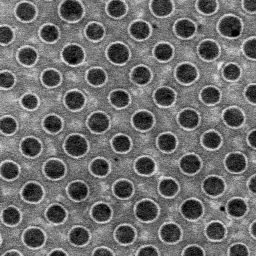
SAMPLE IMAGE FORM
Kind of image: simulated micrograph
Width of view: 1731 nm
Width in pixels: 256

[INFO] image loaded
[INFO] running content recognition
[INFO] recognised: a regular array of raised bodies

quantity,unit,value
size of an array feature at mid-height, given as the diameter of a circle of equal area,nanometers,144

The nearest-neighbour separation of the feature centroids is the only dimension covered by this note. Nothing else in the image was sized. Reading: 214 nm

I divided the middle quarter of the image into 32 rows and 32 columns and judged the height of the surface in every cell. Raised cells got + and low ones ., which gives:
..................++........++++
......++++.......++++.......++++
......++++.......+++++......++++
......+++++......+++++......++++
......++++.......++++........+++
.......++.......................
.............++........++++.....
+++++......+++++......++++++....
+++++......+++++......++++++....
+++++......+++++.......+++++....
+++++.......++++........+++.....
.+++..........................++
.......+++........++++......++++
......+++++......+++++......++++
......+++++......++++++......+++
......+++++......+++++.......+++
.......++++........++...........
..+.....................+++.....
.++++.......++++.......+++++....
++++++......+++++......+++++....
++++++......+++++......+++++....
++++++.......+++........++++....
.++++..........................+
........+..........+++.......+++
.......++++.......+++++......+++
......+++++......++++++......+++
......+++++.......+++++......+++
.......++++........+++........++
..........................+.....
..+++........++++.......++++....
.+++++......+++++.......+++++...
.+++++......+++++.......+++++...